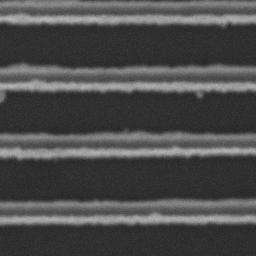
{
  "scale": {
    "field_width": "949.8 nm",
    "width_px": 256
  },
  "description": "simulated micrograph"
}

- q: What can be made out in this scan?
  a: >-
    lines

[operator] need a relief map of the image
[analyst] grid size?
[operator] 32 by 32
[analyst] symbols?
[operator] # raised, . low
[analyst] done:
################################
################################
################################
................................
................................
................................
................................
................................
................................
################################
################################
................................
................................
................................
................................
................................
................................
################################
################################
########...#....................
................................
................................
................................
................................
................................
...#..####.#####################
################################
################################
................................
................................
................................
................................